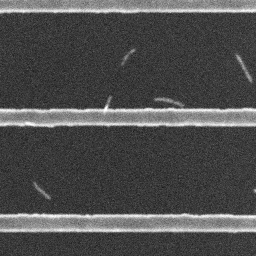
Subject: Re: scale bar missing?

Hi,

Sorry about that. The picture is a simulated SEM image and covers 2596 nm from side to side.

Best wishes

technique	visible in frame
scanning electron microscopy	lines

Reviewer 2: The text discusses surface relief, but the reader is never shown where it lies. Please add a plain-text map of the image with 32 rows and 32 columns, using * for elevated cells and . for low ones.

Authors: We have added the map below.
********************************
................................
................................
................................
................................
................................
................................
................................
................................
................................
................................
................................
................................
................................
********************************
********************************
................................
................................
................................
................................
................................
................................
................................
................................
................................
................................
................................
********************************
********************************
................................
................................
................................